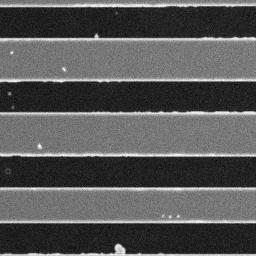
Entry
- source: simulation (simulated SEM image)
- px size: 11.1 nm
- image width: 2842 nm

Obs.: lines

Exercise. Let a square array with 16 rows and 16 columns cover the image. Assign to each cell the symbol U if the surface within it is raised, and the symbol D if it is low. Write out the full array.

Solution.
DDDDDDDDDDDDDDDD
DDDDDDDDDDDDDDDD
UUUUUUUUUUUUUUUU
UUUUUUUUUUUUUUUU
UUUUUUUUUUUUUUUU
DDDDDDDDDDDDDDDD
DDDDDDDDDDDDDDDD
UUUUUUUUUUUUUUUU
UUUUUUUUUUUUUUUU
UUUUUUUUUUUUUUUU
DDDDDDDDDDDDDDDD
DDDDDDDDDDDDDDDD
UUUUUUUUUUUUUUUU
UUUUUUUUUUUUUUUU
DDDDDDDDDDDDDDDD
DDDDDDDDDDDDDDDD